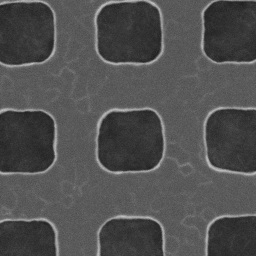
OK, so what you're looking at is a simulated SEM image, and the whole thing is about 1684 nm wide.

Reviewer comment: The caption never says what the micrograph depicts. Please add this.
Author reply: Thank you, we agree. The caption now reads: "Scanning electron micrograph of holes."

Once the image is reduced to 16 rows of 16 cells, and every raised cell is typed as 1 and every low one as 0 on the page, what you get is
0001110000111000
0001110000111000
0001110000111000
0001110000111000
1111111111111111
1111111111111111
1111111111111111
0001110000111000
0001110000111000
0001110000111000
0001111000111100
1111111111111111
1111111111111111
1111111111111110
0001110000111000
0000110000111000